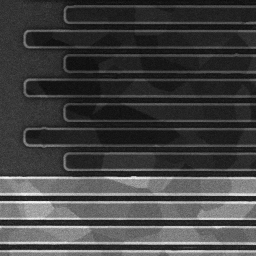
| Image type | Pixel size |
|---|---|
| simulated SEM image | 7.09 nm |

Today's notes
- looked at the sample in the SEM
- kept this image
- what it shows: parallel lines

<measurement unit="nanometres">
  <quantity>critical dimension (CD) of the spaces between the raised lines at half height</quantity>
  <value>54.9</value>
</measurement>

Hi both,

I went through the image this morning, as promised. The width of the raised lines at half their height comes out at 115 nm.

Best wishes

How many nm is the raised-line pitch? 174